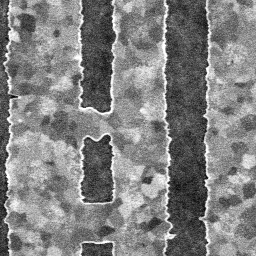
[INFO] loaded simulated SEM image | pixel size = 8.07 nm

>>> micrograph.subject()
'one or a few lines or trenches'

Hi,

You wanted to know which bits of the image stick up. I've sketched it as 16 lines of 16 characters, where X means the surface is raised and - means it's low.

-XXXX--XXX---XXX
-XXXX--XXX---XXX
-XXXX--XXX---XXX
XXXXX--XXX---XXX
XXXXX--XXX---XXX
-XXXX--XXX---XXX
-XXXX--XXX---XXX
-XXXXXXXXX---XXX
-XXXXXXXXXX--XXX
XXXXX--XXXX--XXX
XXXXX--XXXX--XXX
XXXXX--XXXX--XXX
XXXXX--XXX---XXX
XXXXXXXXXX---XXX
-XXXXXXXXXX--XXX
-XXXX--XXX---XXX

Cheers